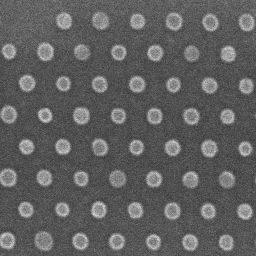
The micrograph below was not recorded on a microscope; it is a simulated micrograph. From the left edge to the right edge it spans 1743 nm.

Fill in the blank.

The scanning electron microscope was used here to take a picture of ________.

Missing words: a regular array of raised bodies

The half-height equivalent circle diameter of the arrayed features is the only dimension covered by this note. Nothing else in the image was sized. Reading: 15.5 px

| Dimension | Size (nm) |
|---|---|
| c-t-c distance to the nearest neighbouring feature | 246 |